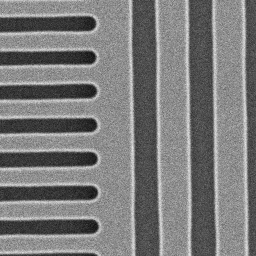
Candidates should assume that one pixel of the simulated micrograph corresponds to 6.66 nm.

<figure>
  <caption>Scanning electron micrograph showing groups of lines, slits or small figures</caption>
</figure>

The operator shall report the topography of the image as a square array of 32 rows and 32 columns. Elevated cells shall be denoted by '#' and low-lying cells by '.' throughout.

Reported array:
################...####....###..
################....###....####.
............####....###....####.
............####....###....####.
################....###....####.
################....###....####.
............####....###....####.
............####....###....####.
################....###....####.
#################...###....####.
########...######...####...####.
............#####...####...####.
........#########...####...####.
#################...####...####.
#################...####...####.
............#####...####...####.
............#####...####...####.
#################...####...####.
#################...####...####.
............#####...####...####.
............#####...####...####.
#################...####...####.
#################...####...####.
............#####...####...####.
............#####...####...####.
#################...####...####.
#################...####...####.
............#####...####...####.
............#####...####...####.
#################...####...####.
#################...####...####.
#################...####...####.